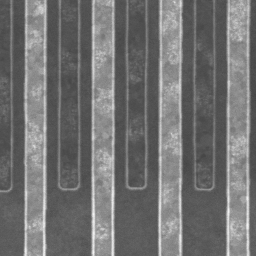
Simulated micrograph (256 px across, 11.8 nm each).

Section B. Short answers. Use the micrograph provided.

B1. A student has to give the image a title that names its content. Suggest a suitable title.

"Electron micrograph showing parallel lines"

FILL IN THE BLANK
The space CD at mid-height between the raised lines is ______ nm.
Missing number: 172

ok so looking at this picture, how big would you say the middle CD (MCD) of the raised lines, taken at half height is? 229 nanometres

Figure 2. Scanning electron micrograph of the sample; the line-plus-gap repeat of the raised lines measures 0.4 microns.